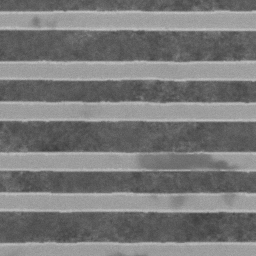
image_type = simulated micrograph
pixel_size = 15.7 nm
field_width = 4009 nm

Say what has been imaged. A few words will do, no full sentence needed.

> lines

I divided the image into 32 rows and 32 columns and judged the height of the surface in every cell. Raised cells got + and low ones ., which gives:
................................
................................
++++++++++++++++++++++++++++++++
++++++++++++++++++++++++++++++++
................................
................................
................................
................................
++++++++++++++++++++++++++++++++
++++++++++++++++++++++++++++++++
................................
................................
................................
++++++++++++++++++++++++++++++++
++++++++++++++++++++++++++++++++
................................
................................
................................
................................
++++++++++++++++++++++++++++++++
++++++++++++++++++++++++++++++++
................................
................................
................................
++++++++++++++++++++++++++++++++
++++++++++++++++++++++++++++++++
................................
................................
................................
................................
...+++++.+++++++.+++++.+++++++++
++++++++++++++++++++++++++++++++